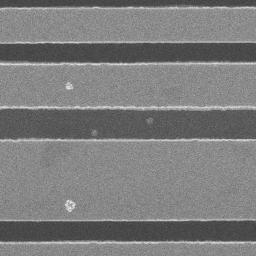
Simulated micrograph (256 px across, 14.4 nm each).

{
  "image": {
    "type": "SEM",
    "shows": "lines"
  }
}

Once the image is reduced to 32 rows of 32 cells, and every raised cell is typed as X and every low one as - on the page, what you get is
--------------------------------
XXXXXXXXXXXXXXXXXXXXXXXXXXXXXXXX
XXXXXXXXXXXXXXXXXXXXXXXXXXXXXXXX
XXXXXXXXXXXXXXXXXXXXXXXXXXXXXXXX
XXXXXXXXXXXXXXXXXXXXXXXXXXXXXXXX
--------------------------------
--------------------------------
--------------------------------
XXXXXXXXXXXXXXXXXXXXXXXXXXXXXXXX
XXXXXXXXXXXXXXXXXXXXXXXXXXXXXXXX
XXXXXXXXXXXXXXXXXXXXXXXXXXXXXXXX
XXXXXXXXXXXXXXXXXXXXXXXXXXXXXXXX
XXXXXXXXXXXXXXXXXXXXXXXXXXXXXXXX
---XX-----XX---X-XXX-----XXX---X
--------------------------------
--------------------------------
--------------------------------
-----X-X------XX--XXX-X-XXXXXXXX
XXXXXXXXXXXXXXXXXXXXXXXXXXXXXXXX
XXXXXXXXXXXXXXXXXXXXXXXXXXXXXXXX
XXXXXXXXXXXXXXXXXXXXXXXXXXXXXXXX
XXXXXXXXXXXXXXXXXXXXXXXXXXXXXXXX
XXXXXXXXXXXXXXXXXXXXXXXXXXXXXXXX
XXXXXXXXXXXXXXXXXXXXXXXXXXXXXXXX
XXXXXXXXXXXXXXXXXXXXXXXXXXXXXXXX
XXXXXXXXXXXXXXXXXXXXXXXXXXXXXXXX
XXXXXXXXXXXXXXXXXXXXXXXXXXXXXXXX
XXXXXXXXXXXXXXXXXXXXXXXXXXX-XXX-
--------------------------------
--------------------------------
XXXXXXXXXXXXXXXXXXXXXXXXXXXXXXXX
XXXXXXXXXXXXXXXXXXXXXXXXXXXXXXXX